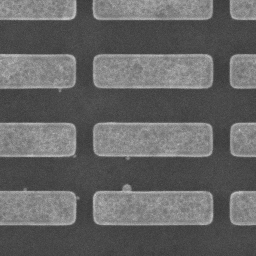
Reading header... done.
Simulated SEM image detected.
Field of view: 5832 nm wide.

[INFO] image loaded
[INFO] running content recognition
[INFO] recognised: wiring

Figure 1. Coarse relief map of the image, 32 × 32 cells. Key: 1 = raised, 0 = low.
11111111100011111111111111100111
11111111100011111111111111100111
00000000000000000000000000000000
00000000000000000000000000000000
00000000000000000000000000000000
00000000000000000000000000000000
00000000000000000000000000000000
11111111100011111111111111100111
11111111100011111111111111100111
11111111100011111111111111100111
11111111100011111111111111000111
00000000000000000000000000000000
00000000000000000000000000000000
00000000000000000000000000000000
00000000000000000000000000000000
11111111100011111111111111000111
11111111100011111111111111100111
11111111100011111111111111100111
11111111100011111111111111100111
11111111000000000000000111000011
00000000000000000000000000000000
00000000000000000000000000000000
00000000000000000000000000000000
00000000000000000000000000000000
11111111100011111111111111000111
11111111100011111111111111100111
11111111100011111111111111100111
11111111100011111111111111000111
00000000000000000000000000000000
00000000000000000000000000000000
00000000000000000000000000000000
00000000000000000000000000000000